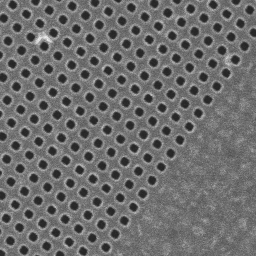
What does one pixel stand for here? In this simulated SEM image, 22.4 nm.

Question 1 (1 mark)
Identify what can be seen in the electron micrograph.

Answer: a regular array of holes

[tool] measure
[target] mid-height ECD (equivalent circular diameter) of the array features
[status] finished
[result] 0.211 micrometres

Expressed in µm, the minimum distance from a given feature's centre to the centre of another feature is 0.361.